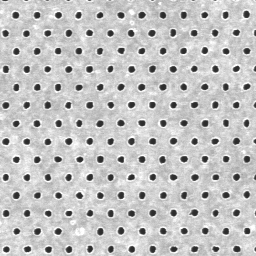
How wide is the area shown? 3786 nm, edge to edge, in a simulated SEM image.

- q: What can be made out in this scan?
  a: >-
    a regular array of holes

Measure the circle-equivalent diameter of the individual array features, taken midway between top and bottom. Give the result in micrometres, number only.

0.103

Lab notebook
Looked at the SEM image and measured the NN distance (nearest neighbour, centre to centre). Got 301 nanometres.